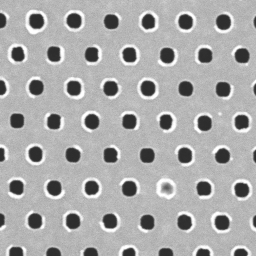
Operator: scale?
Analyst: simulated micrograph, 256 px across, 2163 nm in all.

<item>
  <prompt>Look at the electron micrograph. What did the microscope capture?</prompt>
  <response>a regular array of holes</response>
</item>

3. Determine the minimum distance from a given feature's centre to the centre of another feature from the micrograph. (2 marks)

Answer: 316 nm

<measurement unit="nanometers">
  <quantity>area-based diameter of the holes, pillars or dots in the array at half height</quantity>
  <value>133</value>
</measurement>